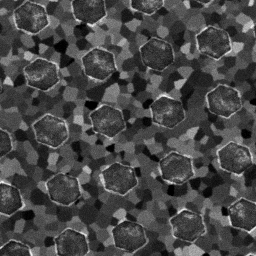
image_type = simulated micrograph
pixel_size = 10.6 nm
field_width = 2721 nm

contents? a regular array of holes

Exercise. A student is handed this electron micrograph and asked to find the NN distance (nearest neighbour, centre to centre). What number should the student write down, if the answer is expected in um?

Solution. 0.613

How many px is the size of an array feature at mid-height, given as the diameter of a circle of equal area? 32.1